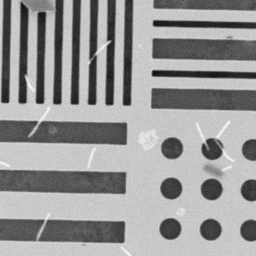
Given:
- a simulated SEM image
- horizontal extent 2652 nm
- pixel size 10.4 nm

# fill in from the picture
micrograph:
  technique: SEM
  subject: groups of lines, slits or small figures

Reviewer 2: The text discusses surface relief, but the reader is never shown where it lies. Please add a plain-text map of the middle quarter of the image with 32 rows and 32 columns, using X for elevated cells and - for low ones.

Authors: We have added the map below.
XX--XX--XX---XX--XXXXXXXXXXXXXXX
XX--XX--XX---XX--XXXXX-------XXX
XX--XX--XX---XX--XXXXX----------
XX--XX--XX---XX--XXXXXXXXXXXXXXX
XX--XX--XX---XX--XXXXXXXXXXXXXXX
XX--XX--XX---XX--XXXXXXXXXXXXXXX
XX--XX--XX---XX--XXXXX----------
XX--XX--XX---XX--XXXXX----------
XX--XX--XX--XXX--XXXXX----------
X---XX--XX--XXX--XXXXX----------
XXXXXXXXXXX-XXX-XXXXX-----------
XXXXXXXXXXXXXXXXXXXXXXXXXXXXX---
XXXXXXXXXXXXXXXXXXXXXXXXXXXXXXXX
XXXXXXXXXXXXXXXXXXXXXXXXXXXXXXXX
---------------XXXXXXXXXXXXXXXXX
----------------XXXXXXXXXXXXXXXX
----------------XXXXXXXXXXXXXXXX
----------------XXXXXXXXXXXXXXXX
----------------XXXXXXXXXX--XXXX
----------------XXXXXXXXX----XXX
XXXXXXXXXXXXXXXXXXXXXXXX------XX
XXXXXXXXXXXXXXXXXXXXXXXX------XX
XXXXXXXXXXXXXXXXXXXXXXXXX----XXX
XXXXXXXXXXXXXXXXXXXXXXXXXX--XXXX
XXXXXXXXXXXXXXXXXXXXXXXXXXXXXXXX
XXXXXXXXXXXXXXXXXXXXXXXXXXXXXXXX
XXXXXXXXXXXXXXXXXXXXXXXXXXXXXXXX
----------------XXXXXXXXXXXXXXXX
----------------XXXXXXXXXX--XXXX
----------------XXXXXXXXX----XXX
----------------XXXXXXXX-----XXX
----------------XXXXXXXX------XX